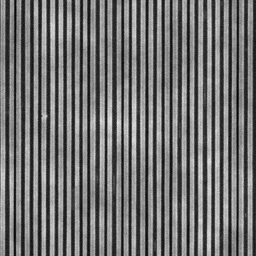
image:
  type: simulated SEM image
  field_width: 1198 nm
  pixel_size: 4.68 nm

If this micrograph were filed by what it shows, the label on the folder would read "parallel lines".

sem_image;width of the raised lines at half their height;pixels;4.25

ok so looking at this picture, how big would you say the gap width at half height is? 4.12 pixels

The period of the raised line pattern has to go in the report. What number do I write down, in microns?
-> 0.0385